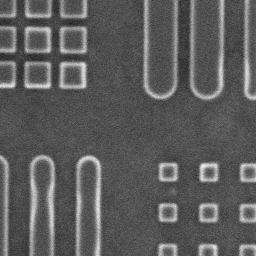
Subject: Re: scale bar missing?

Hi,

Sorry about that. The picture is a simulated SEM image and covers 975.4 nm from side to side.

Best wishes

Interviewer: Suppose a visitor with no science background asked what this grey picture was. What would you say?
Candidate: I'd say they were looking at groups of lines, slits or small figures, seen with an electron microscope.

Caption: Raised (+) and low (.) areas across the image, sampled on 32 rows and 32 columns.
++.+++..+++.......++++..++++...+
++.+++..+++.......++++..++++...+
..................++++..++++...+
++......++........++++..++++...+
++.+++..+++.......++++..++++...+
++.+++..+++.......++++..++++...+
....++..++........++++..++++...+
..................++++..++++...+
++.+++..+++.......++++..++++...+
++.+++..++........++++..++++...+
++.+++..+++.......++++..++++...+
...................+++..+++....+
................................
................................
................................
................................
................................
................................
................................
.....+..........................
+...+++...++........++..........
+...+++...++........++...++...++
+...+++...++........++...++...++
+...+++...++....................
+...++....++....................
+...++....++....................
+...+++...++........++...++...++
+...+++...++........++...++...++
+...+++...++....................
+...+++...++....................
+...+++...++....................
+...+++...++........++...++...++